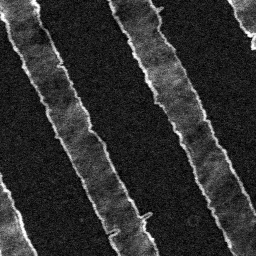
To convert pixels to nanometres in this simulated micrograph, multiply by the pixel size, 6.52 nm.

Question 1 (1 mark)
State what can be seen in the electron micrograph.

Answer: one or a few lines or trenches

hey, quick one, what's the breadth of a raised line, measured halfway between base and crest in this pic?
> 243 nm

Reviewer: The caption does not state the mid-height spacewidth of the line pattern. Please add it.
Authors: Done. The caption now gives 438 nm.